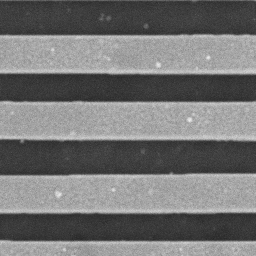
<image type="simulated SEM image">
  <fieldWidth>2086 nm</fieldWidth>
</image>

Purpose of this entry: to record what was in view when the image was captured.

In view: lines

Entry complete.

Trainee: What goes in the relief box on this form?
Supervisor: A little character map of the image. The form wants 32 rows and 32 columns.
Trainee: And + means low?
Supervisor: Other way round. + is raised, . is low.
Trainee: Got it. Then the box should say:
................................
................................
................................
................................
++++++++++++++++++++++++++++++++
++++++++++++++++++++++++++++++++
++++++++++++++++++++++++++++++++
++++++++++++++++++++++++++++++++
++++++++++++++++++++++++++++++++
................................
................................
................................
................................
++++++++++++++++++++++++++++++++
++++++++++++++++++++++++++++++++
++++++++++++++++++++++++++++++++
++++++++++++++++++++++++++++++++
................................
................................
................................
................................
................................
++++++++++++++++++++++++++++++++
++++++++++++++++++++++++++++++++
++++++++++++++++++++++++++++++++
++++++++++++++++++++++++++++++++
++++++++++++++++++++++++++++++++
................................
................................
................................
++++++++++++++++++++++++++++++++
++++++++++++++++++++++++++++++++